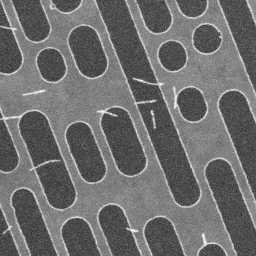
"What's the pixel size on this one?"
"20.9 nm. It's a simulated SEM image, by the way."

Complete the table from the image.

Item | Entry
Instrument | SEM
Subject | parallel lines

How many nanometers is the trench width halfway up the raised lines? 569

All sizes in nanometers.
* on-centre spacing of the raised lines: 797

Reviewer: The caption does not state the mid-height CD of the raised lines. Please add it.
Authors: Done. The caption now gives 219 nanometres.